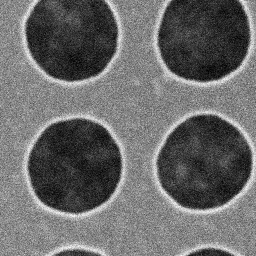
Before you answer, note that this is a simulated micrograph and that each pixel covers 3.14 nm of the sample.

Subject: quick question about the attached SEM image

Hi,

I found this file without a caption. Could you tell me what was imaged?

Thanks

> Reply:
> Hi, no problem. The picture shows holes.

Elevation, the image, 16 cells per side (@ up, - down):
@@-----@@@-----@
@@-----@@@------
@@-----@@@------
@@-----@@@-----@
@@@---@@@@@----@
@@@@@@@@@@@@@@@@
@@@@@@@@@@@@@@@@
@@@@--@@@@@@--@@
@@-----@@@@----@
@@------@@------
@@------@@------
@@-----@@@-----@
@@-----@@@@---@@
@@@@@@@@@@@@@@@@
@@@@@@@@@@@@@@@@
@@@@@@@@@@@@@@@@